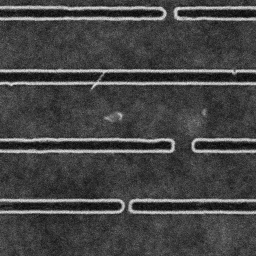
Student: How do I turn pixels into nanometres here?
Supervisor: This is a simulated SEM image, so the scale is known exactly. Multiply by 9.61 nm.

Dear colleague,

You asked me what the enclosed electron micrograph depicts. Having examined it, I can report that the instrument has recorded one or a few lines or trenches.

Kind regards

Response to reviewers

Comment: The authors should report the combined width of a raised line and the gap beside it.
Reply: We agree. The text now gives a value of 619 nm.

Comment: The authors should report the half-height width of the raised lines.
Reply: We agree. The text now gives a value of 118 nm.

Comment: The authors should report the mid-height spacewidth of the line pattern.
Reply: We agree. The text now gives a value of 497 nm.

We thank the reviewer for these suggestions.